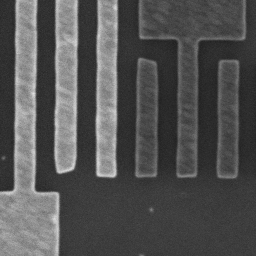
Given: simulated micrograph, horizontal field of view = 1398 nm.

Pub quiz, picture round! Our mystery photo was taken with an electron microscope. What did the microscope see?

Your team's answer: wiring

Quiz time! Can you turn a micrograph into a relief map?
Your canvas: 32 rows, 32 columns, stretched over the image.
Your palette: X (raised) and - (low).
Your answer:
--XXX--XXX--XXX--XXXXXXXXXXXXXX-
--XXX--XXX--XXX--XXXXXXXXXXXXXX-
--XX---XXX--XXX--XXXXXXXXXXXXXX-
--XXX--XXX--XXX--XXXXXXXXXXXXXX-
--XXX--XXX--XXX---XXXXXXXXXXXXX-
--XXX--XXX--XXX-------XXX-------
--XXX--XXX--XXX-------XXX-------
--XX---XXX--XX---XX---XXX-------
--XX---XXX--XX---XXX--XXX--XXX--
--XX---XXX--XX---XXX--XXX--XXX--
--XX---XXX--XX---XXX--XXX--XXX--
--XX---XXX--XX---XXX--XXX--XXX--
--XX---XX---XX---XXX--XXX--XXX--
--XX---XX---XX---XXX--XXX--XXX--
--XX---XX---XX---XXX--XXX--XXX--
--XX---XX---XX---XXX--XXX--XXX--
--XX---XX---XX---XXX--XXX--XXX--
--XX---XX---XX---XXX--XXX--XXX--
--XX---XX---XX---XXX--XXX--XXX--
--XX---XX---XX---XXX--XXX--XXX--
--XX---XX---XX---XXX--XXX--XXX--
--XX---X----XX---XXX--XXX--XXX--
--XX----------------------------
--XX----------------------------
XXXXXXX-------------------------
XXXXXXX-------------------------
XXXXXXX-------------------------
XXXXXXX-------------------------
XXXXXXX-------------------------
XXXXXXX-------------------------
XXXXXXX-------------------------
XXXXXXX-------------------------